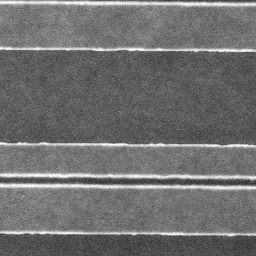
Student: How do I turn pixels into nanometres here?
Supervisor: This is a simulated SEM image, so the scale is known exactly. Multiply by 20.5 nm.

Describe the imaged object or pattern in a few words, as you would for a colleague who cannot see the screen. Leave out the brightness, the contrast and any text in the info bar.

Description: lines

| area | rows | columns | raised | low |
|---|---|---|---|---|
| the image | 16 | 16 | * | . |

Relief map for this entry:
****************
****************
****************
................
................
................
................
................
................
****************
****************
****************
****************
****************
****************
................